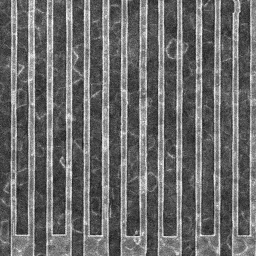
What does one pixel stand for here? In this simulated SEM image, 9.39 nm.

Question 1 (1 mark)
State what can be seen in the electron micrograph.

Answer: parallel lines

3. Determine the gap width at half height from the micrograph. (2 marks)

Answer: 129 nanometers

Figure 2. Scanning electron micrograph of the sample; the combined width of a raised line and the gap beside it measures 174 nanometers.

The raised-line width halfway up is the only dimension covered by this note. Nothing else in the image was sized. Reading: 43.4 nm